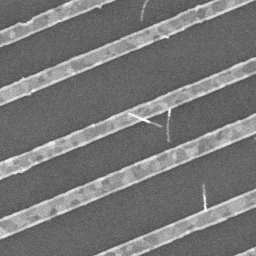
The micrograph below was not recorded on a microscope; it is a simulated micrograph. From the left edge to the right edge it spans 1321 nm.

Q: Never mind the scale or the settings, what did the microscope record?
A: one or a few lines or trenches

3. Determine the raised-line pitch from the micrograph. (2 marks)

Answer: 0.316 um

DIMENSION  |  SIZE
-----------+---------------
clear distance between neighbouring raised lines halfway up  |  271 nanometres